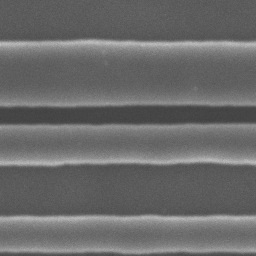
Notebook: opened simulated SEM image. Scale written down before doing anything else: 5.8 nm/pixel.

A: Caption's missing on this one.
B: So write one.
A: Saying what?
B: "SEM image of lines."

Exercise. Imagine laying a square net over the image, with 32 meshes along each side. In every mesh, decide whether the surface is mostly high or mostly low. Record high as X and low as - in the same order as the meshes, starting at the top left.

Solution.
--------------------------------
--------------------------------
--------------------------------
--------------------------------
--------------------------------
XXXXXXXXXXXXXXXXXXXXXXXXXXXXXXXX
XXXXXXXXXXXXXXXXXXXXXXXXXXXXXXXX
XXXXXXXXXXXXXXXXXXXXXXXXXXXXXXXX
XXXXXXXXXXXXXXXXXXXXXXXXXXXXXXXX
XXXXXXXXXXXXXXXXXXXXXXXXXXXXXXXX
XXXXXXXXXXXXXXXXXXXXXXXXXXXXXXXX
XXXXXXXXXXXXXXXXXXXXXXXXXXXXXXXX
XXXXXXXXXXXXXXXXXXXXXXXXXXXXXXXX
--------------------------------
--------------------------------
--------------------------------
XXXXXXXXXXXXXXXXXXXXXXXXXXXXXXXX
XXXXXXXXXXXXXXXXXXXXXXXXXXXXXXXX
XXXXXXXXXXXXXXXXXXXXXXXXXXXXXXXX
XXXXXXXXXXXXXXXXXXXXXXXXXXXXXXXX
------X-------------------------
--------------------------------
--------------------------------
--------------------------------
--------------------------------
--------------------------------
--------------------------------
XXXXXXXXXXXXXXXXXXXXXXXXXXXXXXXX
XXXXXXXXXXXXXXXXXXXXXXXXXXXXXXXX
XXXXXXXXXXXXXXXXXXXXXXXXXXXXXXXX
XXXXXXXXXXXXXXXXXXXXXXXXXXXXXXXX
---------------XXXX-------------